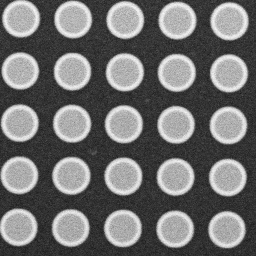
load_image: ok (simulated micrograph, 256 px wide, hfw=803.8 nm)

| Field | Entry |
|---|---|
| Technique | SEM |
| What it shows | an array of small figures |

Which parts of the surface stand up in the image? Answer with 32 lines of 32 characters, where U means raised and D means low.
DUUUDDDDUUDDDDUUUDDDDUUDDDDDUUDD
UUUUUDDUUUUDDDUUUUDDUUUUDDDUUUUD
UUUUUDDUUUUDDUUUUUDDUUUUDDUUUUUD
DUUUUDDUUUUDDDUUUUDDUUUUDDUUUUUD
DDUDDDDDUUDDDDUUUDDDDUUDDDDUUUDD
DDDDDDDDDDDDDDDDDDDDDDDDDDDDDDDD
DDDDDDDDDDDDDDDDDDDDDDDDDDDDDDDD
DUUUDDDUUUUDDDUUUDDDUUUUDDDUUUDD
UUUUUDDUUUUDDUUUUUDDUUUUDDUUUUUD
UUUUUDDUUUUDDUUUUUDDUUUUDDUUUUUD
DUUUDDDUUUUDDDUUUDDDUUUUDDDUUUUD
DDDDDDDDDDDDDDDDDDDDDDDDDDDDUDDD
DDDDDDDDDDDDDDDDDDDDDDDDDDDDDDDD
DUUUDDDDUUDDDDUUUDDDDUUDDDDDUDDD
UUUUUDDUUUUDDUUUUUDDUUUUDDDUUUUD
UUUUUDDUUUUDDUUUUUDDUUUUDDUUUUUD
UUUUUDDUUUUDDUUUUUDDUUUUDDUUUUUD
DUUDDDDDUUDDDDUUUDDDDUUDDDDUUUDD
DDDDDDDDDDDDDDDDDDDDDDDDDDDDDDDD
DDDDDDDDDDDDDDDDDDDDDDDDDDDDDDDD
DUUUDDDUUUUDDDUUUDDDUUUUDDDUUUDD
UUUUUDDUUUUDDUUUUUDDUUUUDDUUUUUD
UUUUUDDUUUUDDUUUUUDDUUUUDDUUUUUD
DUUUDDDUUUUDDDUUUDDDUUUUDDDUUUDD
DDDDDDDDDDDDDDDDDDDDDDDDDDDDUDDD
DDDDDDDDDDDDDDDDDDDDDDDDDDDDDDDD
DUUUDDDDUUDDDDUUDDDDDUUDDDDDUDDD
UUUUDDDUUUUDDUUUUDDDUUUUDDUUUUDD
UUUUUDDUUUUDDUUUUUDDUUUUDDUUUUUD
UUUUDDDUUUUDDUUUUUDDUUUUDDUUUUUD
DUUDDDDDUUDDDDUUUDDDUUUDDDDUUUDD
DDDDDDDDDDDDDDDDDDDDDDDDDDDDDDDD